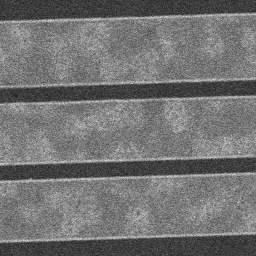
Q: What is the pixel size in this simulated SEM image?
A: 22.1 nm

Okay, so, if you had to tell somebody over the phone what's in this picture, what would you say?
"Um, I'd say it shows one or a few lines or trenches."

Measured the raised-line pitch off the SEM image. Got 1730 nanometres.